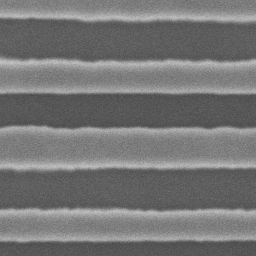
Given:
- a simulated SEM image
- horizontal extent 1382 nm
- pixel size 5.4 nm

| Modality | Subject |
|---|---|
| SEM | lines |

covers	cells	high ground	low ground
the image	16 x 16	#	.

################
................
................
................
################
################
................
................
################
################
................
................
................
################
################
................